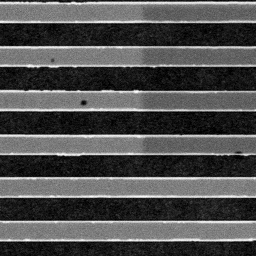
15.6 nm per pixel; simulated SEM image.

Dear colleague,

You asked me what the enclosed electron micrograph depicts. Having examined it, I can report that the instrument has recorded lines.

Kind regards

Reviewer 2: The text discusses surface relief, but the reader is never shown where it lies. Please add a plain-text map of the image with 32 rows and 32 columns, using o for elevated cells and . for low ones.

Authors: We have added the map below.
oooooooooooooooooooooooooooooooo
oooooooooooooooooooooooooooooooo
oooooooooooooooooooooooooooooooo
................................
................................
................................
oooooooooooooooooooooooooooooooo
oooooooooooooooooooooooooooooooo
................................
................................
................................
oooooooooooooooooooooooooooooooo
oooooooooooooooooooooooooooooooo
oooooooooooooooooooooooooooooooo
................................
................................
................................
oooooooooooooooooooooooooooooooo
oooooooooooooooooooooooooooooooo
................................
................................
................................
oooooooooooooooooooooooooooooooo
oooooooooooooooooooooooooooooooo
oooooooooooooooooooooooooooooooo
................................
................................
................................
oooooooooooooooooooooooooooooooo
oooooooooooooooooooooooooooooooo
................................
................................